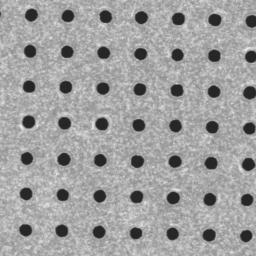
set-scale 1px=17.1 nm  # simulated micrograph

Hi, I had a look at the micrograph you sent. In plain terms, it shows a regular array of holes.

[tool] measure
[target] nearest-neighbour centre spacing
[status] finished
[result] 609 nanometres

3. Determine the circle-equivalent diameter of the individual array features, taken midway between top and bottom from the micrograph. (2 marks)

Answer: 0.226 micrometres